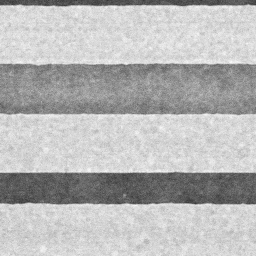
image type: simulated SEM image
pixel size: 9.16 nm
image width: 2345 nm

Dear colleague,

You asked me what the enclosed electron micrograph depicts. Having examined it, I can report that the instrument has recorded lines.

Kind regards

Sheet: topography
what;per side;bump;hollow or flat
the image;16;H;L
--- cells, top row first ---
HHHHHHHHHHHHHHHH
HHHHHHHHHHHHHHHH
HHHHHHHHHHHHHHHH
HHHHHHHHHHHHHHHH
LLLLLLLLLLLLLLLL
LLLLLLLLLLLLLLLL
LLLLLLLLLLLLLLLL
HHHHHHHHHHHHHHHH
HHHHHHHHHHHHHHHH
HHHHHHHHHHHHHHHH
HHHHHHHHHHHHHHHH
LLLLLLLLLLLLLLLL
LLLLLLLLLLLLLLLL
HHHHHHHHHHHHHHHH
HHHHHHHHHHHHHHHH
HHHHHHHHHHHHHHHH